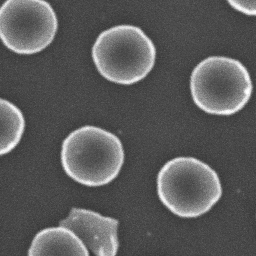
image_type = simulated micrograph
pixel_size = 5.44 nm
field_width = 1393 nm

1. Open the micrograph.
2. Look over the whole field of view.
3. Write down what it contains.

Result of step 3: raised bodies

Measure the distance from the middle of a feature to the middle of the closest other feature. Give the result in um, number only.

0.551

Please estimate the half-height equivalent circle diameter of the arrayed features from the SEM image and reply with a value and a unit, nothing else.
0.318 um